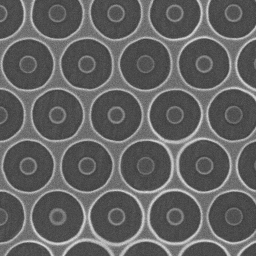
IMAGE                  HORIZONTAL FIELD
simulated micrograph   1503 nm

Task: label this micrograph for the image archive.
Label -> an array of small figures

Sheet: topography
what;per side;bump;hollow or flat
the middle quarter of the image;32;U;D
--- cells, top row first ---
DDDDUUUUDDDDUUDDDDUUUUDDDDDUUDDD
DDDDUUUDDDDDUUDDDDDUUUDDDDDUUDDD
DDDDDDDDDDDDUUUDDDDDDDDDDDUUUDDD
DDDDDDDDDDDUUUUDDDDDDDDDDDUUUUDD
UDDDDDDDDDDUUUUUDDDDDDDDDUUUUUDD
UUDDDDDDDUUUUUUUUDDDDDDDUUUUUUUU
UUUUUUUUUUUUDDUUUUUUDUUUUUUDDUUU
DDUUUUUUUUDDDDDDDUUUUUUUDDDDDDDU
DDDUUUUUDDDDDDDDDDUUUUUDDDDDDDDD
DDDDUUUDDDDDDDDDDDDUUUDDDDDDDDDD
DDDDUUUDDDDDDDDDDDDUUUDDDDDDDDDD
DDDDDUUDDDDDUUDDDDDUUDDDDDUUUDDD
DDDDDUUDDDDUUUUDDDDDUDDDDDUUUUDD
DDDDDUUDDDDUUUUDDDDUUDDDDDUUUUDD
DDDDDUUDDDDDDDDDDDDUUUDDDDDUUDDD
DDDDUUUDDDDDDDDDDDDUUUDDDDDDDDDD
DDDDUUUUDDDDDDDDDDUUUUDDDDDDDDDD
DDDUUUUUUDDDDDDDDUUUUUUDDDDDDDDD
DDUUUUUUUUDDDDDDUUUUUUUUDDDDDDDU
UUUUDDDDUUUUUUUUUUDDDDDUUUUDUUUU
UUDDDDDDDDUUUUUUDDDDDDDDDUUUUUDD
UDDDDDDDDDDUUUUDDDDDDDDDDDUUUUDD
DDDDDDDDDDDUUUUDDDDDDDDDDDUUUDDD
DDDDDDDDDDDDUUDDDDDDDDDDDDDUUDDD
DDDDUUUUDDDDUUDDDDDUUUDDDDDUDDDD
DDDDUUUUDDDDUUDDDDUUUUDDDDDUUDDD
DDDDUUUDDDDDUUDDDDDUUUDDDDDUUDDD
DDDDDDDDDDDDUUDDDDDDUDDDDDDUUDDD
DDDDDDDDDDDUUUUDDDDDDDDDDDUUUDDD
UDDDDDDDDDDUUUUDDDDDDDDDDDUUUUDD
UUDDDDDDDDUUUUUUDDDDDDDDDUUUUUUD
UUUDDDDDUUUUUUUUUUDDDDDUUUUUUUUU